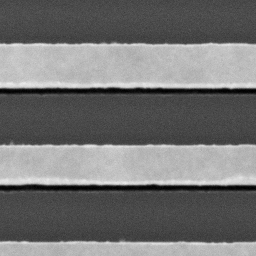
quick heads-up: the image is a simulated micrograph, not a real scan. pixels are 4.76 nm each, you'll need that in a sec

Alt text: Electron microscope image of lines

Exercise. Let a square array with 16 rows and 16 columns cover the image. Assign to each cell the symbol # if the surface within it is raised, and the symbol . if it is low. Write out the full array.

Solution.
................
................
................
################
################
................
................
................
................
################
################
...#############
................
................
................
################